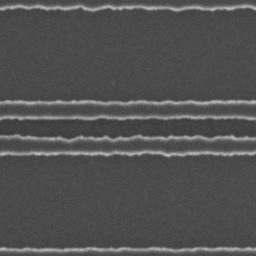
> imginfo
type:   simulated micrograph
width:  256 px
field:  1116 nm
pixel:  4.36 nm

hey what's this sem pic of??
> lines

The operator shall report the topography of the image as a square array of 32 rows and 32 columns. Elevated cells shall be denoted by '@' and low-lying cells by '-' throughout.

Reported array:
@@@@@@@@@@@@@@@@@@@@@@@@@@@@@@@@
--------------------------------
--------------------------------
--------------------------------
--------------------------------
--------------------------------
--------------------------------
--------------------------------
--------------------------------
--------------------------------
--------------------------------
--------------------------------
--------------------------------
@@@@@@@@@@@@@@@@@@@@@@@@@@@@@@@@
@@@@@@@@@@@@@@@@@@@@@@@@@@@@@@@@
--------------------------------
--------------------------------
@@@@@@@@@@@@@@@@@@@@@@@@@@@@@@@@
@@@@@@@@@@@@@@@@@@@@@@@@@@@@@@@@
--------------------------------
--------------------------------
--------------------------------
--------------------------------
--------------------------------
--------------------------------
--------------------------------
--------------------------------
--------------------------------
--------------------------------
--------------------------------
--------------------------------
@@@@@@@@@@@@@@@@@@@@@@@@@@@@@@@@